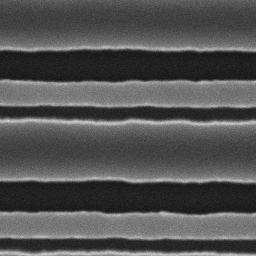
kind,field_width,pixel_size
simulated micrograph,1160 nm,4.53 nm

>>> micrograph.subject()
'lines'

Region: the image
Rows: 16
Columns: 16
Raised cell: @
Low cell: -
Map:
@@@@@@@@@@@@@@@@
@@@@@@@@@@@@@@@@
@@@@@@@@@@@@@@@@
----------------
----------------
@@@@@@@@@@@@@@@@
@@@@@@@@@@@@@@@@
@@@@@@@@@@@@@@@@
@@@@@@@@@@@@@@@@
@@@@@@@@@@@@@@@@
@@@@@@@@@@@@@@@@
----------------
----------------
@@@@@@@@@@@@@@@@
@@@@@@@@@@@@@@@@
@@@@@@@@@@@@@@@@